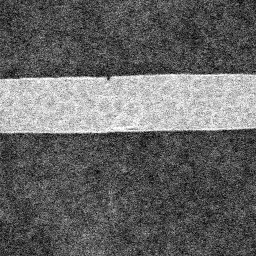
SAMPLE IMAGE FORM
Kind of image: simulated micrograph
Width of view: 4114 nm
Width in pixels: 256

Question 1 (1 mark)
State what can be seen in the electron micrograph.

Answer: one or a few lines or trenches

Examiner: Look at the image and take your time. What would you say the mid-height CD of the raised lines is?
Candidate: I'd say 863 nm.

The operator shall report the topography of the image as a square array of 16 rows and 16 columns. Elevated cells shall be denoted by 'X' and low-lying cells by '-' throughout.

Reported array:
----------------
----------------
----------------
----------------
----------------
XXXXXXXXXXXXXXXX
XXXXXXXXXXXXXXXX
XXXXXXXXXXXXXXXX
----------------
----------------
----------------
----------------
----------------
----------------
----------------
----------------